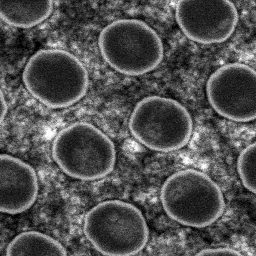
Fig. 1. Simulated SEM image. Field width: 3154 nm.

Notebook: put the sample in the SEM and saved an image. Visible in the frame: raised bodies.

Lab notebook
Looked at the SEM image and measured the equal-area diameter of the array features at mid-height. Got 697 nm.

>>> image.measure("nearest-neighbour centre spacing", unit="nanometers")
999